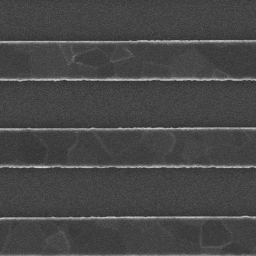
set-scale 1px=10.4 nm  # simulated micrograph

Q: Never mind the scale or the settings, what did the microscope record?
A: lines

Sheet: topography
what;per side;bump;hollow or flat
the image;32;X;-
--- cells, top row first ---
--------------------------------
--------------------------------
--------------------------------
--------------------------------
--------------------------------
XXXXXXXXXXXXXXXXXXXXXXXXXXXXXXXX
XXXXXXXXXXXXXXXXXXXXXXXXXXXXXXXX
XXXXXXXXXXXXXXXXXXXXXXXXXXXXXXXX
XXXXXXXXXXXXXXXXXXXXXXXXXXXXXXXX
XXXXXXXXXXXXXXXXXXXXXXXXXXXXXXXX
--------------------------------
--------------------------------
--------------------------------
--------------------------------
--------------------------------
--------------------------------
XXXXXXXXXXXXXXXXXXXXXXXXXXXXXXXX
XXXXXXXXXXXXXXXXXXXXXXXXXXXXXXXX
XXXXXXXXXXXXXXXXXXXXXXXXXXXXXXXX
XXXXXXXXXXXXXXXXXXXXXXXXXXXXXXXX
XXXXXXXXXXXXXXXXXXXXXXXXXXXXXXXX
--------------------------------
--------------------------------
--------------------------------
--------------------------------
--------------------------------
--------------------------------
XXXXXXXXXXXXXXXXXXXXXXXXXXXXXXXX
XXXXXXXXXXXXXXXXXXXXXXXXXXXXXXXX
XXXXXXXXXXXXXXXXXXXXXXXXXXXXXXXX
XXXXXXXXXXXXXXXXXXXXXXXXXXXXXXXX
XXXXXXXXXXXXXXXXXXXXXXXXXXXXXXXX